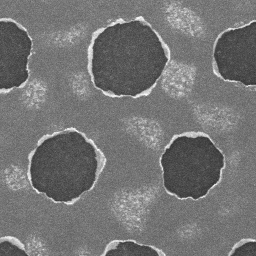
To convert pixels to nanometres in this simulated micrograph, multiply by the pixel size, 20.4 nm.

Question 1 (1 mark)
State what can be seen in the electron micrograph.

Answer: holes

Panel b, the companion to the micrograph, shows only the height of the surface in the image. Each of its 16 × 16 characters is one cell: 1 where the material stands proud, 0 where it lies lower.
1111111111111111
0111111001111111
0011110000111100
0011110000111000
0011110000111100
0111110001111111
1111111111111111
1111111111111111
1110011111111111
1100001111000011
1100001111000011
1100001111000111
1110111111111111
1111111111111111
1111111111111111
0111111001111110